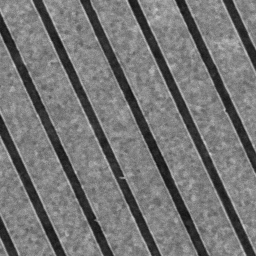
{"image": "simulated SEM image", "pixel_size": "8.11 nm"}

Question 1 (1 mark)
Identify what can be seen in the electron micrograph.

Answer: parallel lines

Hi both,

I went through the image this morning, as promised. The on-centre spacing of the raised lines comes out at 350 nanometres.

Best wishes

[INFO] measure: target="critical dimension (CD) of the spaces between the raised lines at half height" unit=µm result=0.0845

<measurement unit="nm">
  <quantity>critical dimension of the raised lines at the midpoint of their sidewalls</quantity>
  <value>268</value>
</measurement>